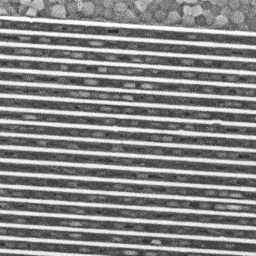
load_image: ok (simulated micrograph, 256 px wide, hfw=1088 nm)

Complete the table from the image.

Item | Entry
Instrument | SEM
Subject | parallel lines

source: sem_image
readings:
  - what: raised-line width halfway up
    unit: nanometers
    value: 11.7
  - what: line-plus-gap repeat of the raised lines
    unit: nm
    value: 54.9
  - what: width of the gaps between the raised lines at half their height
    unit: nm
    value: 43.5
